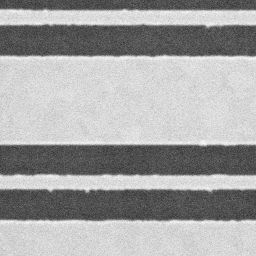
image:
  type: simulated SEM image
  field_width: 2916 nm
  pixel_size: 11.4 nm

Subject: lines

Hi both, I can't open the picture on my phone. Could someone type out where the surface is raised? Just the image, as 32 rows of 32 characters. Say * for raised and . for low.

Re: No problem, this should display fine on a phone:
................................
********************************
********************************
................................
................................
................................
................................
********************************
********************************
********************************
********************************
********************************
********************************
********************************
********************************
********************************
********************************
********************************
................................
................................
................................
................................
********************************
********************************
................................
................................
................................
................................
********************************
********************************
********************************
********************************